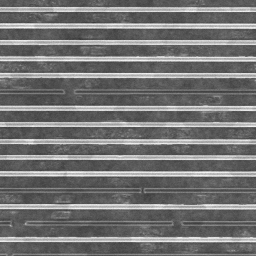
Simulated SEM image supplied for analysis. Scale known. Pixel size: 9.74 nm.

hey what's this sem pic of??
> parallel lines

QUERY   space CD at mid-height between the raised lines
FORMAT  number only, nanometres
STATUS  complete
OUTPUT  129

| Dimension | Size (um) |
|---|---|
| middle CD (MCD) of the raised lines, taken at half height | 0.0341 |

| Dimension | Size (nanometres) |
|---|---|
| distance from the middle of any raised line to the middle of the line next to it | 160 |